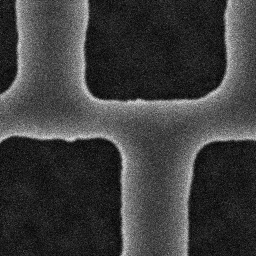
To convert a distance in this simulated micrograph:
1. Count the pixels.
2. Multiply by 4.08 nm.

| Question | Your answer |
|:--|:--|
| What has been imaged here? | holes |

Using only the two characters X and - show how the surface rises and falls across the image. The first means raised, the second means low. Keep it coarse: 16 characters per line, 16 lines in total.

-XXXXX--------XX
-XXXX---------XX
-XXXX---------XX
-XXXX---------XX
-XXXX---------XX
-XXXX--------XXX
XXXXXXXXXXXXXXXX
XXXXXXXXXXXXXXXX
XXXXXXXXXXXXXXXX
--------XXXX----
--------XXXX----
--------XXXX----
--------XXXX----
--------XXXX----
--------XXXX----
--------XXXX----